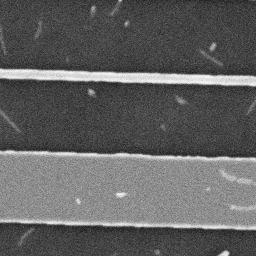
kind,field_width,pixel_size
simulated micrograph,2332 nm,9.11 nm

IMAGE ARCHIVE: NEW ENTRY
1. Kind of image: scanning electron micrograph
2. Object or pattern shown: lines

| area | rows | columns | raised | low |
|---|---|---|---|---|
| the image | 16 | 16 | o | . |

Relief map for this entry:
................
................
................
................
...o............
................
................
................
................
o...............
oooooooooooooooo
oooooooooooooooo
oooooooooooooooo
oooooooooooooooo
................
................